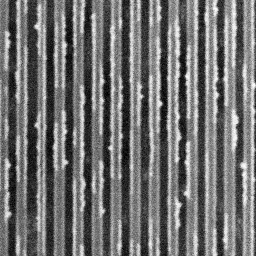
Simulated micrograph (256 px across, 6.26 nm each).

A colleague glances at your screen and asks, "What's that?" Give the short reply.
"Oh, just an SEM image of parallel lines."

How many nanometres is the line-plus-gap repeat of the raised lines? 118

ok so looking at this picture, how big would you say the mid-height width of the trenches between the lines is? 60.2 nm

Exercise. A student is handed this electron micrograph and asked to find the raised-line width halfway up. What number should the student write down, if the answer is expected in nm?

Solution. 60.2